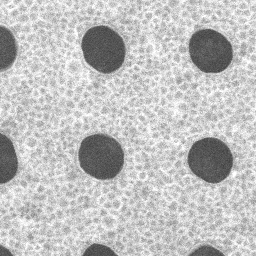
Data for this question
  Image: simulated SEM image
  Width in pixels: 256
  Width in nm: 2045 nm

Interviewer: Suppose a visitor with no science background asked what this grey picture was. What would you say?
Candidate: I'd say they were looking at holes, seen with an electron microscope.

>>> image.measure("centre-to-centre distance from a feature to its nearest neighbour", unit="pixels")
107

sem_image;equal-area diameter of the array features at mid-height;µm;0.366